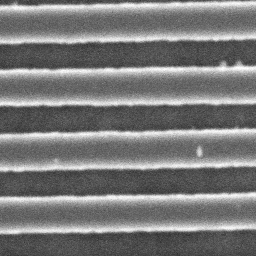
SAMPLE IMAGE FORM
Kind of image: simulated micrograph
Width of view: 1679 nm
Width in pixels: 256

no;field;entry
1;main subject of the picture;lines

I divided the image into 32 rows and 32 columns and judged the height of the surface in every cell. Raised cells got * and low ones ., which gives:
.....................***********
********************************
********************************
********************************
********************************
................................
................................
................................
.............................***
********************************
********************************
********************************
********************************
................................
................................
................................
.....................***********
********************************
********************************
********************************
********************************
................................
................................
................................
......................*.********
********************************
********************************
********************************
********************************
................................
................................
................................